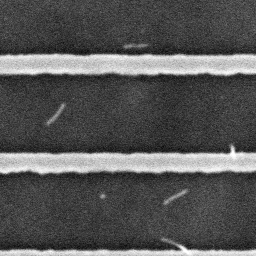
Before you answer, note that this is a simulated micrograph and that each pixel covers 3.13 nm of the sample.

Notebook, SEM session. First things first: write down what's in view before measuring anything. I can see lines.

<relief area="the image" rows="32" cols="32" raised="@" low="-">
--------------------------------
--------------------------------
--------------------------------
--------------------------------
--------------------------------
--------------------------------
--------------------------------
@@@@@@@@@@@@@@@@@@@@@@@@@@@@@@@@
@@@@@@@@@@@@@@@@@@@@@@@@@@@@@@@@
--------------------------------
--------------------------------
--------------------------------
--------------------------------
--------------------------------
--------------------------------
--------------------------------
--------------------------------
--------------------------------
--------------------------------
@@@@@@@@@@@@@@@@@@@@@@@@@@@@@@@@
@@@@@@@@@@@@@@@@@@@@@@@@@@@@@@@@
--------------------------------
--------------------------------
--------------------------------
--------------------------------
--------------------------------
--------------------------------
--------------------------------
--------------------------------
--------------------------------
--------------------------------
@@@@@@@@@@@@@@@@@@@@@@@@@@@@@@@@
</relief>